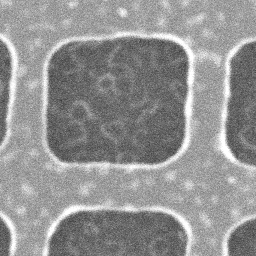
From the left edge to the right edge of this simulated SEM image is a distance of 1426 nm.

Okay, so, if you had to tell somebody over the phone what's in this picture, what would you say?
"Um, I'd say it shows holes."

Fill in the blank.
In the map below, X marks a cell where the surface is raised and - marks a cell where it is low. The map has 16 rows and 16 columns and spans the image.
XXXXXXXXXXXXXXXX
XXXXXXXXXXXXXXXX
XXXXX------XXXXX
-XX---------XX--
-XX---------XX--
-XX---------XX--
-XX---------XX--
XXX---------XX--
XXX---------XX--
XXX--------XXX--
XXXXXXXXXXXXXXXX
XXXXXXXXXXXXXXXX
XXXXXXXXXXXXXXXX
XXXX-------XXXXX
-XX---------XX--
-XX---------XX--